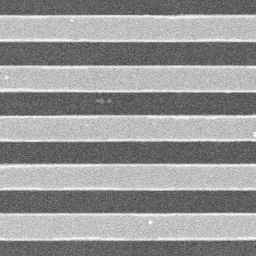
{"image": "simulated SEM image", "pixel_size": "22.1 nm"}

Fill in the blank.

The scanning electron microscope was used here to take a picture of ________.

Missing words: lines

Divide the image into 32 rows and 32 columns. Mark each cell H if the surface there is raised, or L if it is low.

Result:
LLLLLLLLLLLLLLLLLLLLLLLLLLLLLLLL
LLLLLLLLLLLLLLLLLLLLLLLLLLLLLLLL
HHHHHHHHHHHHHHHHHHHHHHHHHHHHHHHH
HHHHHHHHHHHHHHHHHHHHHHHHHHHHHHHH
HHHHHHHHHHHHHHHHHHHHHHHHHHHHHHHH
LLLLLLLLLLLLLLLLLLLLLLLLLLLLLLLL
LLLLLLLLLLLLLLLLLLLLLLLLLLLLLLLL
LLLLLLLLLLLLLLLLLLLLLLLLLLLLLLLL
HHHHHHHHHHHHHHHHHHHHHHHHHHHHHHHH
HHHHHHHHHHHHHHHHHHHHHHHHHHHHHHHH
HHHHHHHHHHHHHHHHHHHHHHHHHHHHHHHH
LLLLLLLLLLLLLLLLLLLLLLLLLLLLLLLL
LLLLLLLLLLLLLLLLLLLLLLLLLLLLLLLL
LLLLLLLLLLLLLLLLLLLLLLLLLLLLLLLL
LLLLLLLLLLLLLHHHLHHLLLLLLLLLHHHH
HHHHHHHHHHHHHHHHHHHHHHHHHHHHHHHH
HHHHHHHHHHHHHHHHHHHHHHHHHHHHHHHH
HHHHHHHHHHHHHHHHHHHHHHHHHHHHHHHH
LLLLLLLLLLLLLLLLLLLLLLLLLLLLLLLL
LLLLLLLLLLLLLLLLLLLLLLLLLLLLLLLL
LLLLLLLLLLLLLLLLLLLLLLLLLLLLLLLL
HHHHHHHHHHHHHHHHHHHHHHHHHHHHHHHH
HHHHHHHHHHHHHHHHHHHHHHHHHHHHHHHH
HHHHHHHHHHHHHHHHHHHHHHHHHHHHHHHH
LLLLLLLLLLLLLLLLLLLLLLLLLLLLLLLL
LLLLLLLLLLLLLLLLLLLLLLLLLLLLLLLL
LLLLLLLLLLLLLLLLLLLLLLLLLLLLLLLL
HHHHHHHHHHHHHHHHHHHHHHHHHHHHHHHH
HHHHHHHHHHHHHHHHHHHHHHHHHHHHHHHH
HHHHHHHHHHHHHHHHHHHHHHHHHHHHHHHH
LLLLLLLLLLLLLLLLLLLLLLLLLLLLLLLL
LLLLLLLLLLLLLLLLLLLLLLLLLLLLLLLL